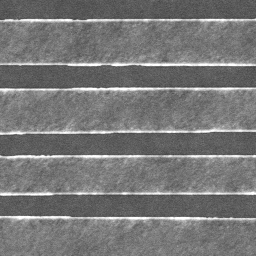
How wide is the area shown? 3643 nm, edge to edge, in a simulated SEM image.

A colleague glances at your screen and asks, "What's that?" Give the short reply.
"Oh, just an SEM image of lines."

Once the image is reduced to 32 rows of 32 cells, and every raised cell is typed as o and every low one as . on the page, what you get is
................................
................................
.oooooooo..ooooooooooooooooooooo
oooooooooooooooooooooooooooooooo
oooooooooooooooooooooooooooooooo
oooooooooooooooooooooooooooooooo
oooooooooooooooooooooooooooooooo
oooooooooooooooooooooooooooooooo
................................
................................
................................
oooooooooooooooooooooooooooooooo
oooooooooooooooooooooooooooooooo
oooooooooooooooooooooooooooooooo
oooooooooooooooooooooooooooooooo
oooooooooooooooooooooooooooooooo
ooooooooooooo...................
................................
................................
................................
oooooooooooooooooooooooooooooooo
oooooooooooooooooooooooooooooooo
oooooooooooooooooooooooooooooooo
oooooooooooooooooooooooooooooooo
................................
................................
................................
oooooooooooooooooooooooooooooooo
oooooooooooooooooooooooooooooooo
oooooooooooooooooooooooooooooooo
oooooooooooooooooooooooooooooooo
oooooooooooooooooooooooooooooooo